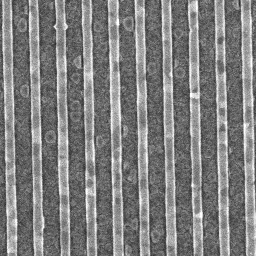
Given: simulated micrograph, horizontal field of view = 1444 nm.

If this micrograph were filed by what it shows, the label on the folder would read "parallel lines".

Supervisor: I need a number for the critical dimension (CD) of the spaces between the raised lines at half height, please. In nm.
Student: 97.3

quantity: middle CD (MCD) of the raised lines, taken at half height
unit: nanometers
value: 48.6